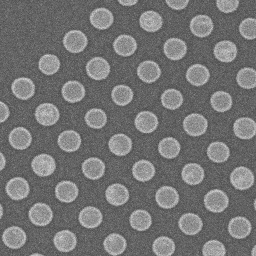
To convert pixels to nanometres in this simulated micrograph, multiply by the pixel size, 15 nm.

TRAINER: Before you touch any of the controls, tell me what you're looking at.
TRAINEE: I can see a regular array of raised bodies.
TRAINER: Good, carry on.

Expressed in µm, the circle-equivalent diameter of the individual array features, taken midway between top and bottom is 0.321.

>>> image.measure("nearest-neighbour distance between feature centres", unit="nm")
520